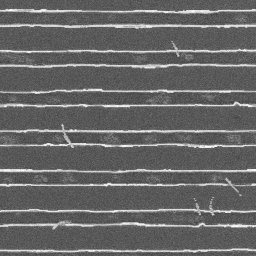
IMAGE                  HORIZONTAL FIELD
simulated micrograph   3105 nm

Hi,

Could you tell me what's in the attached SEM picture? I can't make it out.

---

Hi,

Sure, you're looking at parallel lines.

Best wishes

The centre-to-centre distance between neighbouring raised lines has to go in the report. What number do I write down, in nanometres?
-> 484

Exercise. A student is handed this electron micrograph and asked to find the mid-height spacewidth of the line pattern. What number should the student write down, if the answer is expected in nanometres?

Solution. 164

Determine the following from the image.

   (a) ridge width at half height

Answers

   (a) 318 nm